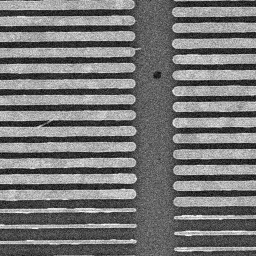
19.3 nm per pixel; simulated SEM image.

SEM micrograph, groups of lines, slits or small figures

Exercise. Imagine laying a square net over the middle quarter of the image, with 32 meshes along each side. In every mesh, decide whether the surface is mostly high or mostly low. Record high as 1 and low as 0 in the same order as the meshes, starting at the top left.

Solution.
11111111111111111100000000000000
11111111111111111100000000000000
00000000000000000000000000011111
00000000000000000000000000001111
11111111111111111100000000000000
11111111111111111000000000000000
00000000000000000000000000011111
00000000000000000000000000001111
11111111111111111100000000000000
11111111111111111100000000000000
00000000000000000000000000011111
00000000000000000000000000001111
11111111111111111100000000000000
11111111111111111100000000000000
00000000000000000000000000011111
00000000000000000000000000001111
11111111111111111100000000000000
11111111111111111100000000000000
00000000000000000000000000011111
00000000000000000000000000001111
11111111111111111100000000000000
11111111111111111000000000000000
00000000000000000000000000001111
00000000000000000000000000001111
11111111111111111100000000000000
11111111111111111100000000001111
00000000000000000000000000001111
00000000000000000000000000001111
11111111111111111100000000000000
11111111111111111100000000000011
00000000000000000000000000001111
00000000000011111000000000001111